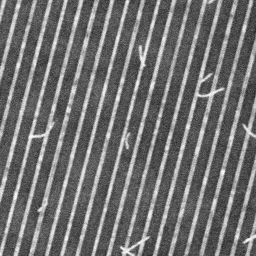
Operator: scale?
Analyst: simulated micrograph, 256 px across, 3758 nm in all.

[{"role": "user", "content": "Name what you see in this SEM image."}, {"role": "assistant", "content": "parallel lines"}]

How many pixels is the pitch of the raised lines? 15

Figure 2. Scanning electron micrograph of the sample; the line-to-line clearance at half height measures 183 nanometres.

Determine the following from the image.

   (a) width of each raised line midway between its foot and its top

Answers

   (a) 32 nm